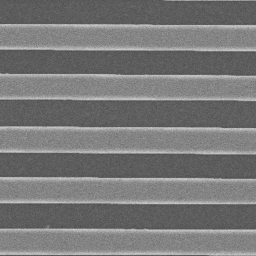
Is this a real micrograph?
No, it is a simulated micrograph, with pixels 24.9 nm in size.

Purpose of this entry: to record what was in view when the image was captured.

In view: lines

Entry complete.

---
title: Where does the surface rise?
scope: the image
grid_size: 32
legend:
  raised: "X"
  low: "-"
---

--------------------------------
--------------------------------
--------------------------------
XXXXXXXXXXXXXXXXXXXXXXXXXXXXXXXX
XXXXXXXXXXXXXXXXXXXXXXXXXXXXXXXX
XXXXXXXXXXXXXXXXXXXXXXXXXXXXXXXX
--------------------------------
--------------------------------
--------------------------------
XXXXXXXXXXXXXXXXXXXXXXXXXXXXX---
XXXXXXXXXXXXXXXXXXXXXXXXXXXXXXXX
XXXXXXXXXXXXXXXXXXXXXXXXXXXXXXXX
-----------------------------XXX
--------------------------------
--------------------------------
--------------------------------
XXXXXXXXXXXXXXXXXXXXXXXXXXXXXXXX
XXXXXXXXXXXXXXXXXXXXXXXXXXXXXXXX
XXXXXXXXXXXXXXXXXXXXXXXXXXXXXXXX
--------------------------------
--------------------------------
--------------------------------
XXXXXXXXXXXXXXXXXXXXXXXXXXXXXXXX
XXXXXXXXXXXXXXXXXXXXXXXXXXXXXXXX
XXXXXXXXXXXXXXXXXXXXXXXXXXXXXXXX
--------------------------------
--------------------------------
--------------------------------
--------------------------------
XXXXXXXXXXXXXXXXXXXXXXXXXXXXXXXX
XXXXXXXXXXXXXXXXXXXXXXXXXXXXXXXX
XXXXXXXXXXXXXXXXXXXXXXXXXXXXXXXX